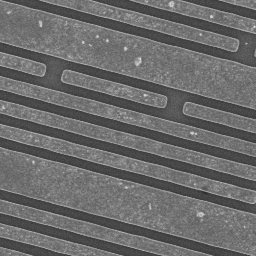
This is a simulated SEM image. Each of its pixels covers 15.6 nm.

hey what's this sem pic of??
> groups of lines, slits or small figures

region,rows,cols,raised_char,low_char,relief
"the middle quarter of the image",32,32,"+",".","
.......+++++++++++++++++++++++++
..........++++++++++++++++++++++
+++++.........++++++++++++++++++
++++++++..........++++++++++++++
++++++++++++..........++++++++++
....++++++++++++..........++++++
.......+++++++++++++.........+++
+..........+++++++++++++........
+++++..........+++++++++++......
+++++++++.........++++++++......
++++++++++++..........+++.....++
...+++++++++++++..............++
.......+++++++++++++..........++
+..........+++++++++++++........
+++++..........+++++++++++++....
+++++++++.........+++++++++++++.
++++++++++++..........++++++++++
...+++++++++++++..........++++++
.......++++++++++++++.........++
++.........+++++++++++++........
+++++..........+++++++++++++....
+++++++++.........+++++++++++++.
+++++++++++++.........++++++++++
...+++++++++++++..........++++++
........++++++++++++...........+
+++........++++++++++++++.......
++++++.........+++++++++++++....
++++++++++.........+++++++++++++
+++++++++++++..........+++++++++
+++++++++++++++++..........+++++
++++++++++++++++++++..........++
+++++++++++++++++++++++++.......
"